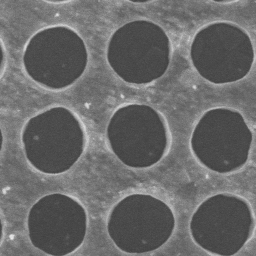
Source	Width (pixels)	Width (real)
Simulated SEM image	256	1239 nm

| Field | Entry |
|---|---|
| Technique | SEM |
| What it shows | holes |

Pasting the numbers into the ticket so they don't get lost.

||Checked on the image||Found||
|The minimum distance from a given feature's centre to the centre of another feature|404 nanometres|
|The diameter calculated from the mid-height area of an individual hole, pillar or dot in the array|304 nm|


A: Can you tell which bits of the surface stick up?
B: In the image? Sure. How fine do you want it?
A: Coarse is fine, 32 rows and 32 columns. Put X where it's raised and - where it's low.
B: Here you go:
XXXXXXXXXXXXXXXXXXXXXXXXXXXXXXXX
XXXXXXXXXXXXXXXXXXXXXXXXXXXXXXXX
XXXXXXXXXXXXXXXXXXXXXXXXXXXXXXXX
XXXXXX---XXXXXX-----XXXXX-----XX
XXXX------XXXX-------XXX-------X
XXXX-------XX--------XXX-------X
XXX--------XX--------XXX--------
-XX--------XX--------XXX--------
XXX--------XXX-------XXX-------X
XXXX------XXXXX-----XXXXX------X
XXXXX----XXXXXXXXXXXXXXXXXXXXXXX
XXXXXXXXXXXXXXXXXXXXXXXXXXXXXXXX
XXXXXXXXXXXXXXXXXXXXXXXXXXXXXXXX
XXXXXXX-XXXXXXX----XXXXXXXXXXXXX
XXXXX----XXXXX------XXXXX-----XX
XXX-------XXXX-------XXXX------X
XXX-------XXX--------XXX-------X
XXX--------XXX-------XXX-------X
XXX--------XXX-------XXX-------X
XXX-------XXXXX-----XXXX-------X
XXXX-----XXXXXXX---XXXXXX------X
XXXXX---XXXXXXXXXXXXXXXXXXX--XXX
XXXXXXXXXXXXXXXXXXXXXXXXXXXXXXXX
XXXXXXXXXXXXXXXXXXXXXXXXXXXXXXXX
XXXXXX--XXXXXXXX---XXXXXXX----XX
XXXX------XXXXX------XXXX------X
XXXX-------XXX-------XXX-------X
XXXX-------XX---------XX--------
XXXX-------XX---------XX--------
XXXX-------XXX-------XXX-------X
XXXX------XXXX------XXXXX------X
XXXXXX---XXXXXXX---XXXXXXX----XX